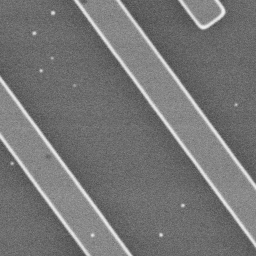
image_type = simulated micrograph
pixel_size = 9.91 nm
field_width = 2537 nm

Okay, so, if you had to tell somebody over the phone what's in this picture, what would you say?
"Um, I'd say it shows groups of lines, slits or small figures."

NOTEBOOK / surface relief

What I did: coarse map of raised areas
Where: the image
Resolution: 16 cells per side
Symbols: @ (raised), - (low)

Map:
-----@@@----@@--
------@@@---@---
-------@@-------
-------@@@------
--------@@@-----
---------@@-----
@--------@@@----
@@--------@@@---
@@@--------@@@--
-@@---------@@--
-@@@--------@@@-
--@@@--------@@@
---@@@--------@@
----@@---------@
----@@@--------@
-----@@@--------